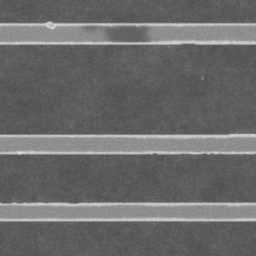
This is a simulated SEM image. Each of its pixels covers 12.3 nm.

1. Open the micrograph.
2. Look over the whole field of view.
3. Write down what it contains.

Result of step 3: lines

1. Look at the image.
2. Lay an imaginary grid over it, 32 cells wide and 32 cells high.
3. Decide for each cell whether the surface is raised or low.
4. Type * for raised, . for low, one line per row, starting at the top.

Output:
................................
................................
................................
********************************
********************************
................................
................................
................................
................................
................................
................................
................................
................................
................................
................................
................................
................................
********************************
********************************
................................
................................
................................
................................
................................
................................
..............*.*.....*.*****..*
********************************
********************..***.****..
................................
................................
................................
................................